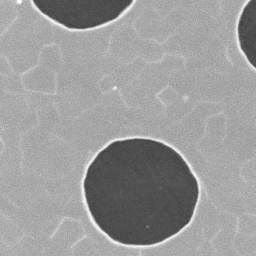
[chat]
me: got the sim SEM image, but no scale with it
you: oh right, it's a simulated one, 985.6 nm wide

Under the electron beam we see holes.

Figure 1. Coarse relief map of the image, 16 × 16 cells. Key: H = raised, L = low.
HHLLLLLLHHHHHHHL
HHHHLLHHHHHHHHHL
HHHHHHHHHHHHHHHL
HHHHHHHHHHHHHHHL
HHHHHHHHHHHHHHHH
HHHHHHHHHHHHHHHH
HHHHHHHHHHHHHHHH
HHHHHHHHHHHHHHHH
HHHHHHHHHHHHHHHH
HHHHHHLLLLLHHHHH
HHHHHHLLLLLLHHHH
HHHHHLLLLLLLHHHH
HHHHHLLLLLLLHHHH
HHHHHHLLLLLLHHHH
HHHHHHLLLLLHHHHH
HHHHHHHHHHHHHHHH